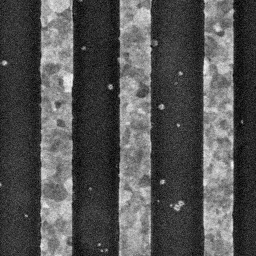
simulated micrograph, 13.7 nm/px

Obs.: lines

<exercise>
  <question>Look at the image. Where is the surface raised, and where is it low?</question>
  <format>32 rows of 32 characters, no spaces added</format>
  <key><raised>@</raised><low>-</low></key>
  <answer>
-----@@@@------@@@@-------@@@---
-----@@@@------@@@@-------@@@---
-----@@@@------@@@@-------@@@---
-----@@@@------@@@@-------@@@---
-----@@@@------@@@@-------@@@---
-----@@@@------@@@@-------@@@---
-----@@@@------@@@@-------@@@---
-----@@@@------@@@@-------@@@---
-----@@@@------@@@@-------@@@---
-----@@@@------@@@@-------@@@---
-----@@@@------@@@@-------@@@---
-----@@@@------@@@@-------@@@---
-----@@@@------@@@@-------@@@---
-----@@@@------@@@@-------@@@---
-----@@@@------@@@@-------@@@---
-----@@@@------@@@@-------@@@---
-----@@@@------@@@@-------@@@---
-----@@@@------@@@@-------@@@---
-----@@@@------@@@@-------@@@---
-----@@@@------@@@@-------@@@---
-----@@@@------@@@@-------@@@---
-----@@@@------@@@@-------@@@---
-----@@@@------@@@@-------@@@---
-----@@@@------@@@@-------@@@---
-----@@@@------@@@@-------@@@---
-----@@@@------@@@@-------@@@---
-----@@@@------@@@@-------@@@---
-----@@@@------@@@@-------@@@---
-----@@@@------@@@@-------@@@---
-----@@@@------@@@@-------@@@---
-----@@@@------@@@@-------@@@---
-----@@@@------@@@@-------@@@---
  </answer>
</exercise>